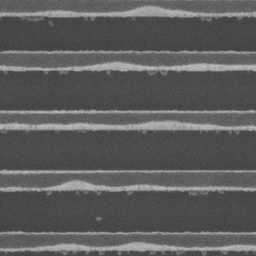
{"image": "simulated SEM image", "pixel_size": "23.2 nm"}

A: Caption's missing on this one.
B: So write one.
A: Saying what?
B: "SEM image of lines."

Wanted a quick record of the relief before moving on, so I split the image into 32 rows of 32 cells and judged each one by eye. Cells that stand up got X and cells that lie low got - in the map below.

XXXXXXXXXXXXXXXXXXXXXXXXXXXXXXXX
XXXXXXXXXXXXXXXXXX-XXXXXXXXXXXXX
--------------------------------
--------------------------------
--------------------------------
--------------------------------
XXX--X-----XXX-XXXXXXXXX----XX--
XXXXXXXXXXXXXXXXXXXXXXXXXXXXXXXX
XXXXXXXXXXXX-----XXXXXXX----XX--
--------------------------------
--------------------------------
--------------------------------
--------------------------------
--------------------------------
XXXXXXXXXXXXXXXXXXXXXXXXXXXXXXXX
XXXXXXXXXXXXXXXXXXXXXXXXXXXXXXXX
--------------------------------
--------------------------------
--------------------------------
--------------------------------
--------------------------------
XXXXXXXXXXXXXXXXXXXXXXXXXXXXXXXX
XXXXXXXXXXXXXXXXXXXXXXXXXXXXXXXX
XXXXXXX-----XXXXX--XXXXXXXXXXXXX
--------------------------------
--------------------------------
--------------------------------
--------------------------------
--------------------------------
XXXXXXXXXXXXXXXXXXXXXXXXXXXXXXXX
XXXXXXXXXXXXXXXXXXXXXXXXXXXXXXXX
--------------------------------